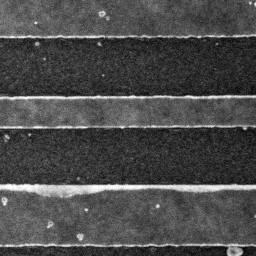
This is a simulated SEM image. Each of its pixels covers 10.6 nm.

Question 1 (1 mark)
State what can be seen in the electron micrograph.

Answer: lines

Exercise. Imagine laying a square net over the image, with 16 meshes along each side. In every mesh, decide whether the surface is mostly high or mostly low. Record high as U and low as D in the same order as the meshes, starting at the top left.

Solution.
UUUUUUUUUUUUUUUU
UUUUUUUUUUUUUUUU
DDDDDDDDDDDDDDDD
DDDDDDDDDDDDDDDD
DDDDDDDDDDDDDDDD
DDDDDDDDDDDDDDDD
UUUUUUUUUUUUUUUU
UUUUUUUUUUUUUUUU
DDDDDDDDDDDDDDDD
DDDDDDDDDDDDDDDD
DDDDDDDDDDDDDDDD
DDDDDDDDDDDDDDDD
UUUUUUUUUUUUUUUU
UUUUUUUUUUUUUUUU
UUUUUUUUUUUUUUUU
DDDDDDDDDDDDDDDD